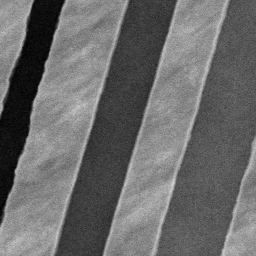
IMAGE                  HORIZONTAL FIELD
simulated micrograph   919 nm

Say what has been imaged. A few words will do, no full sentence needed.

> one or a few lines or trenches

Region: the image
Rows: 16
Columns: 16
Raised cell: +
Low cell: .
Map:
++..++++...+++..
++..++++...+++..
++.++++...++++..
+..++++...+++...
+..++++...+++...
+.++++....+++...
..++++...+++....
..++++...+++....
..++++...+++....
.++++...++++....
.++++...+++....+
.++++...+++....+
++++...++++....+
++++...+++.....+
++++...+++....++
++++...+++....++